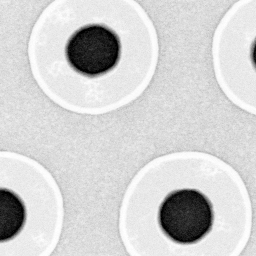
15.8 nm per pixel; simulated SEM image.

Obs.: ring-shaped raised bodies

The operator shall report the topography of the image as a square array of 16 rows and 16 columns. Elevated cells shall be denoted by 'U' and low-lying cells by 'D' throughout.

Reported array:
DDDUUUUUUDDDDDDU
DDUUUUUUUDDDDDUU
DDUUDDDUUUDDDDUU
DDUUDDDUUUDDDUUU
DDUUUDDUUDDDDDUU
DDDUUUUUUDDDDDUU
DDDDUUUUDDDDDDDU
DDDDDDDDDDDDDDDD
DDDDDDDDDDDDDDDD
DDDDDDDDDDDDDDDD
UUUDDDDDDUUUUUDD
UUUDDDDDUUUUUUUD
DUUUDDDDUUDDDUUD
DDUUDDDDUUDDDUUU
DUUUDDDDUUDDDUUD
UUUDDDDDUUUUUUUD